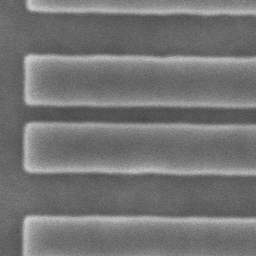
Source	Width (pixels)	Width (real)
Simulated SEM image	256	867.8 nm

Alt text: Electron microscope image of wiring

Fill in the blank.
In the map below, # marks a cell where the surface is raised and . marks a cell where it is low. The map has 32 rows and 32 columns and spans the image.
...#############################
.............###################
................................
................................
................................
................................
................................
...#############################
...#############################
...#############################
...#############################
...#############################
...#############################
................................
................................
....#########...................
...#############################
...#############################
...#############################
...#############################
...#############################
....###......###################
................................
................................
................................
................................
................................
...#############################
...#############################
...#############################
...#############################
...#############################